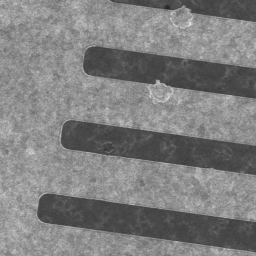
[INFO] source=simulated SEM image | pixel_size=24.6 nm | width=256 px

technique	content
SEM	one or a few lines or trenches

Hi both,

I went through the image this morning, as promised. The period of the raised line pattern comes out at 1870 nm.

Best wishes